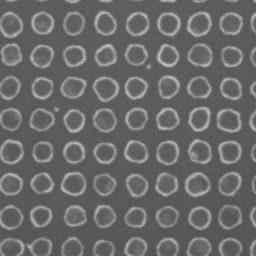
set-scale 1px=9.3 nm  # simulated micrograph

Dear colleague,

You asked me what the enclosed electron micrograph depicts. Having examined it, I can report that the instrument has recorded a regular array of raised bodies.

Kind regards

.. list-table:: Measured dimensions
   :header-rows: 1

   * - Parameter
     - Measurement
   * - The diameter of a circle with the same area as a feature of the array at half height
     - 198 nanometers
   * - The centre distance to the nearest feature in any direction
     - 0.287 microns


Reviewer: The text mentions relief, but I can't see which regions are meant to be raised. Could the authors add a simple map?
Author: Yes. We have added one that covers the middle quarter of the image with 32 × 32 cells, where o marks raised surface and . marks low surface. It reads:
................................
................................
................................
.oo..............o.......oo.....
ooooo...ooooo...oooo....oooo....
ooooo...ooooo...ooooo...oooo...o
ooooo...ooooo...oooo....oooo...o
oooo....ooooo...oooo....oooo....
.........ooo.....o..............
................................
................................
..........o......oo......oo.....
.oooo...oooo....ooooo...oooo....
ooooo..oooooo...ooooo..ooooo....
ooooo...ooooo...oooo....oooo....
.ooo....ooooo...oooo....oooo....
.ooo.....ooo....................
................................
................................
.................o..............
.ooo....oooo....oooo....oooo....
ooooo...ooooo...ooooo..ooooo....
ooooo...ooooo..oooooo..ooooo....
ooooo...oooo....ooooo...oooo....
.ooo.....oo..............ooo....
................................
................................
.ooo............................
ooooo...oooo....oooo...ooooo...o
ooooo..oooooo...ooooo..ooooo...o
ooooo..oooooo...ooooo..ooooo...o
ooooo...oooo....oooo...ooooo...o